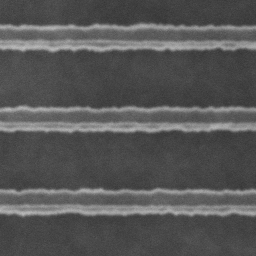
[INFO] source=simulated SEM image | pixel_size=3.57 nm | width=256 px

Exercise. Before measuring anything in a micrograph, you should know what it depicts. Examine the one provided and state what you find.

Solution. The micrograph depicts lines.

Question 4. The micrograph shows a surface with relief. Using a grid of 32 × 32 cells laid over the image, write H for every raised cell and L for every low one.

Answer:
LLLLLLLLLLLLLLLLLLLLLLLLLLLLLLLL
LLLLLLLLLLLLLLLLLLLLLLLLLLLLLLLL
LLLLLLLLLLLLLLLLLLLLLLLLLLLLLLLL
HHHHHHHHHHHHHHHHHHHHHHHHHHHHHHHH
HHHHHHHHHHHHHHHHHHHHHHHHHHHHHHHH
HHHHHHHHHHHHHHHHHHHHHHHHHHHHHHHH
LLLLLLLLLLLLLLLLLLLLLLLLLLLLLLLL
LLLLLLLLLLLLLLLLLLLLLLLLLLLLLLLL
LLLLLLLLLLLLLLLLLLLLLLLLLLLLLLLL
LLLLLLLLLLLLLLLLLLLLLLLLLLLLLLLL
LLLLLLLLLLLLLLLLLLLLLLLLLLLLLLLL
LLLLLLLLLLLLLLLLLLLLLLLLLLLLLLLL
LLLLLLLLLLLLLLLLLLLLLLLLLLLLLLLL
LLHLLLLLLLLLLLLLHLLLLLLLLLLLLLLL
HHHHHHHHHHHHHHHHHHHHHHHHHHHHHHHH
HHHHHHHHHHHHHHHHHHHHHHHHHHHHHHHH
LLLLLLLLLLLLLLLLLLLLLLLLLLLLLLLL
LLLLLLLLLLLLLLLLLLLLLLLLLLLLLLLL
LLLLLLLLLLLLLLLLLLLLLLLLLLLLLLLL
LLLLLLLLLLLLLLLLLLLLLLLLLLLLLLLL
LLLLLLLLLLLLLLLLLLLLLLLLLLLLLLLL
LLLLLLLLLLLLLLLLLLLLLLLLLLLLLLLL
LLLLLLLLLLLLLLLLLLLLLLLLLLLLLLLL
LLLLLLLLLLLLLLLLLLLLLLLLLLLLLLLL
HHHHHHHHHHHHHHHHHHHHHHHHHHHHHHHH
HHHHHHHHHHHHHHHHHHHHHHHHHHHHHHHH
HHHHHHHHHHHHHHHHHHHHHHHHHHHHHHHH
LLLLLLLLLLLLLLLLLLLLLLLLLLLLLLLL
LLLLLLLLLLLLLLLLLLLLLLLLLLLLLLLL
LLLLLLLLLLLLLLLLLLLLLLLLLLLLLLLL
LLLLLLLLLLLLLLLLLLLLLLLLLLLLLLLL
LLLLLLLLLLLLLLLLLLLLLLLLLLLLLLLL